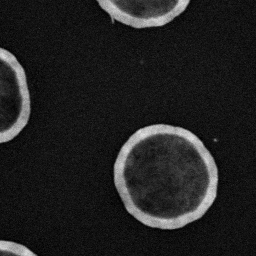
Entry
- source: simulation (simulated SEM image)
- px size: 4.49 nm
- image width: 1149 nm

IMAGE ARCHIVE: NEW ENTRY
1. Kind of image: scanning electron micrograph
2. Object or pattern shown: raised bodies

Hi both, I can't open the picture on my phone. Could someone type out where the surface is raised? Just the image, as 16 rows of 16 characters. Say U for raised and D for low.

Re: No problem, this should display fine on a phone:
DDDDDDDUUUUDDDDD
DDDDDDDDDDDDDDDD
DDDDDDDDDDDDDDDD
DDDDDDDDDDDDDDDD
UDDDDDDDDDDDDDDD
UUDDDDDDDDDDDDDD
UUDDDDDDDDDDDDDD
UDDDDDDDDDDDDDDD
DDDDDDDDDUUUDDDD
DDDDDDDDUUUUUDDD
DDDDDDDUUUUUUDDD
DDDDDDDDUUUUUDDD
DDDDDDDDUUUUUDDD
DDDDDDDDDUUUDDDD
DDDDDDDDDDDDDDDD
UDDDDDDDDDDDDDDD